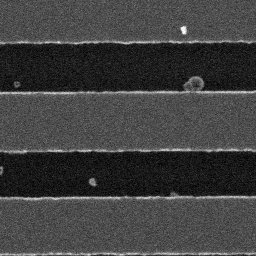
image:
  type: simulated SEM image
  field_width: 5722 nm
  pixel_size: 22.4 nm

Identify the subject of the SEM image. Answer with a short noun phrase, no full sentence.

lines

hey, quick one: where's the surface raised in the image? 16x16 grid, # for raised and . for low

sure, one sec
################
################
################
................
................
................
################
################
################
................
................
................
################
################
################
################